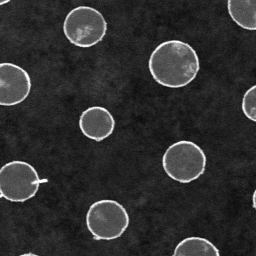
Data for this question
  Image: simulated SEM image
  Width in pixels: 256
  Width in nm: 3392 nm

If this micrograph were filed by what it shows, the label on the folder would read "raised bodies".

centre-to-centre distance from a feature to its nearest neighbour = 96.3 px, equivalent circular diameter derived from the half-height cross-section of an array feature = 539 nm